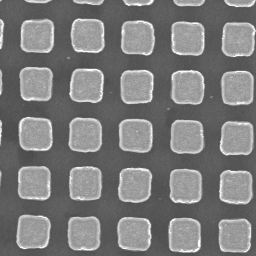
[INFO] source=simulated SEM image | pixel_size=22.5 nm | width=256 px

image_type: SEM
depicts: a regular array of raised bodies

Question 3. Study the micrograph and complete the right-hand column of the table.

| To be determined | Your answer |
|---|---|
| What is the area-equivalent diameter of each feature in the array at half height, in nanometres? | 809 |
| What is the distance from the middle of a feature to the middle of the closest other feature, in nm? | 1100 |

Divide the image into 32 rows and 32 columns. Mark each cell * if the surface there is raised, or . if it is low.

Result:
...........*....***...***...****
................................
..........**....................
...****..****..****...***...****
...****..****..****...***...****
...****..****..****...***...****
................***...***...****
................................
...***..........................
..*****..****..****...***...****
...***...****..****...***...****
...***...****..****...***...****
...***...****..****...***...****
................................
................................
..****...****..****...***...***.
..*****..****..****..****...****
..*****..****..****..****...****
...***...***...****..****...***.
................................
................................
..****...***...****...***...***.
..****...****..****..****...***.
..****...****..****..****..****.
...***...***...****..****..****.
.............................**.
................................
..****...***...***....**....***.
..****...***...****..****..****.
..****...***...****..****..****.
..****...***...****..****..****.
......................**........